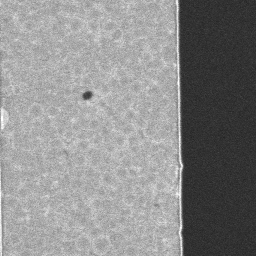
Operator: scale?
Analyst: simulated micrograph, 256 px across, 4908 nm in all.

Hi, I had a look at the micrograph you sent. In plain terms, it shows one or a few lines or trenches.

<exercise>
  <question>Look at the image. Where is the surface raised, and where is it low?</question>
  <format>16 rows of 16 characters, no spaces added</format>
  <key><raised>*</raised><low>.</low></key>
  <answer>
...........*****
...........*****
...........*****
...........*****
...........*****
...........*****
...........*****
...........*****
...........*****
...........*****
...........*****
...........*****
...........*****
...........*****
...........*****
...........*****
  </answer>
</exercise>